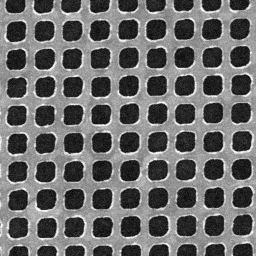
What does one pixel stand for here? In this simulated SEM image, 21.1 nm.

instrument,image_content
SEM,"a regular array of holes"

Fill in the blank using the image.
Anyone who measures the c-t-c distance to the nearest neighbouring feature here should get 587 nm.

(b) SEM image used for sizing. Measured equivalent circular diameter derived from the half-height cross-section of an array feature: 464 nm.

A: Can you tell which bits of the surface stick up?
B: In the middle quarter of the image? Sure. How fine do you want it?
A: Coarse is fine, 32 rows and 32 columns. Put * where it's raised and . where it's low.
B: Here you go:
....***....***....***....***....
********************************
********************************
*...****...***.....**.....**....
.....**.....**.....**.....**....
.....**.....**.....**.....**....
.....**.....**.....**.....**....
....***....***....***....***....
********************************
********************************
*...****...***.....**.....**....
.....**.....**.....**.....**....
.....**.....**.....**.....**....
.....**.....**.....**.....**....
....***....***....***....***....
********************************
********************************
*...****....**.....***....***...
.....**.....**.....**.....**....
.....**.....**.....**.....**....
.....**.....**.....**.....**....
.....**.....**....***....***....
********************************
********************************
*...****....***....***....**....
.....**.....**.....**.....**....
.....**.....**.....**.....**....
.....**.....**.....**.....**....
.....**....***.....**....***....
*...****.***********************
********************************
*....***....***....***....***...